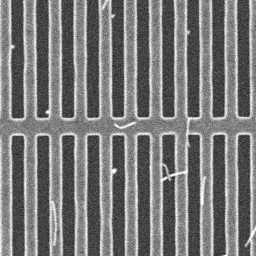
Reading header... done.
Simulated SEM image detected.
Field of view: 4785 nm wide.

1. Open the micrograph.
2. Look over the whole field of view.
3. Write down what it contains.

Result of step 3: groups of lines, slits or small figures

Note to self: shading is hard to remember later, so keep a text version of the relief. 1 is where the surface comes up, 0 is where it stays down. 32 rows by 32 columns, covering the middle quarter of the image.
00011000011100011100001100001100
00011000011100011100001100001100
00011000011100011100001100001100
00011000011100011100001100001110
00011000011100011100001100001110
00011000011100011100001100001110
00011000011100011100001100001110
00011000011100011100001100001110
00011000011100011100001100001110
00011000011100011100001100001110
00011000011100011100001100001110
00011000011100011100001100001110
00011000011100011100001100001110
00111100111110111111111111111111
11111111111111111111111111111111
11111111111111111111111111111111
11111111111111111111111111111111
11111111111111111110011110001110
00011100011100011100001100001110
00011100011100011100001100001110
00011000011100011100001100001110
00011100011100011100001100001110
00011100011100001100001100001110
00011100011100001100001100001110
00011100011100011100001100001110
00011100011100011100001100001110
00011100011100001100001100001110
00011100011100001100001100011110
00011100011100001100001110001110
00011100011100001100001110001110
00011100011100001100001100001110
00011100011100001100001100001110